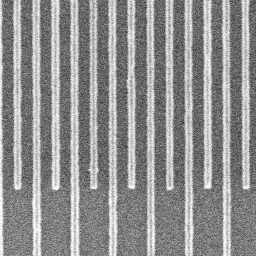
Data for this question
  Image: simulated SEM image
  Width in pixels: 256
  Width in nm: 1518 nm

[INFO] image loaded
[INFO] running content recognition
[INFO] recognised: parallel lines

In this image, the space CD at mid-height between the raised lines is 13.9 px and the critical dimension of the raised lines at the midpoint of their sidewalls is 31.1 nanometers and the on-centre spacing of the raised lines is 113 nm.